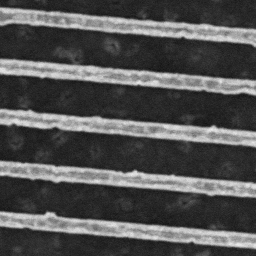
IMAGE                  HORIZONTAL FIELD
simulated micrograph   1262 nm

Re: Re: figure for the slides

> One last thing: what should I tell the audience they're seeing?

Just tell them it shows parallel lines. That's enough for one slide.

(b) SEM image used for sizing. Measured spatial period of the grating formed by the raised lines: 250 nm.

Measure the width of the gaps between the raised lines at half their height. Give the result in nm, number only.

193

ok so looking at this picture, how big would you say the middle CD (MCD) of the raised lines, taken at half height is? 55.2 nm